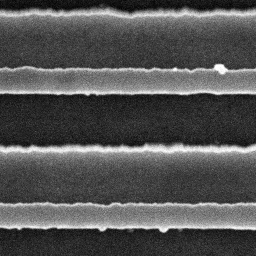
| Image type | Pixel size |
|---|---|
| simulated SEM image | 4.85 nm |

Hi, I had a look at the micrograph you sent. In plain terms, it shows lines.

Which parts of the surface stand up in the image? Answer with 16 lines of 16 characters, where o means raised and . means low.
................
oooooooooooooooo
oooooooooooooooo
oooooooooooooooo
oooooooooooooooo
oooooooooooooooo
................
................
................
oooooooooooooooo
oooooooooooooooo
oooooooooooooooo
oooooooooooooooo
oooooooooooooooo
................
................